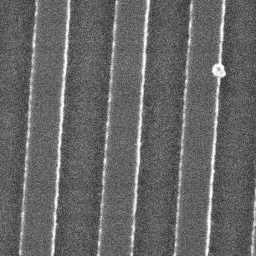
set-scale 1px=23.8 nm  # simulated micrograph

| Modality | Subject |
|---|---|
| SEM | lines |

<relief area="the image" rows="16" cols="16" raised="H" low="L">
LLHHLLLHHLLLHHLL
LLHHLLLHHLLLHHLL
LLHHLLLHHLLLHHLL
LLHHLLLHHLLLHHLL
LLHHLLLHHLLLHHLL
LLHHLLLHHLLLHHLL
LLHHLLLHHLLLHHLL
LLHHLLLHHLLHHHLL
LLHHLLLHHLLHHLLL
LLHHLLLHHLLHHLLL
LLHHLLHHHLLHHLLL
LLHHLLHHHLLHHLLL
LHHHLLHHLLLHHLLL
LHHLLLHHLLLHHLLL
LHHLLLHHLLLHHLLL
LHHLLLHHLLLHHLLL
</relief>